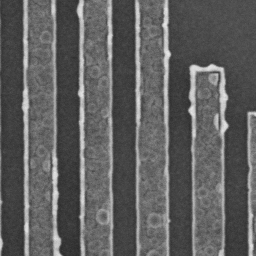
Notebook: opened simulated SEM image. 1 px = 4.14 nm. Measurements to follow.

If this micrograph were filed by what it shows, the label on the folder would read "parallel lines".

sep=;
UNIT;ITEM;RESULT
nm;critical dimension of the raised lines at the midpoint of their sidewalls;127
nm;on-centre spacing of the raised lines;232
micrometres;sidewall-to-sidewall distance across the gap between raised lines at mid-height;0.102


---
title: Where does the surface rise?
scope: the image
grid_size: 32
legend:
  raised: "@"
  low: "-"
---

---@@@@---@@@@---@@@@-----------
---@@@@---@@@@---@@@@-----------
---@@@@---@@@@---@@@@-----------
---@@@@---@@@@---@@@@-----------
---@@@@---@@@@---@@@@-----------
---@@@@---@@@@---@@@@-----------
---@@@@---@@@@---@@@@-----------
---@@@@---@@@@---@@@@-----------
---@@@@---@@@@---@@@@---@@@@----
---@@@@---@@@@---@@@@---@@@@----
---@@@@---@@@@---@@@@---@@@@----
---@@@@---@@@@---@@@@---@@@@----
---@@@@---@@@@---@@@@---@@@@----
---@@@@---@@@@---@@@@---@@@@----
---@@@@---@@@@---@@@@---@@@@---@
---@@@@---@@@@---@@@@---@@@@---@
---@@@@---@@@@---@@@@---@@@@---@
---@@@@---@@@@---@@@@---@@@@---@
---@@@@---@@@@---@@@@---@@@@---@
---@@@@---@@@@---@@@@---@@@@---@
---@@@@---@@@@---@@@@---@@@@---@
---@@@@---@@@@---@@@@---@@@@---@
---@@@@---@@@@---@@@@---@@@@---@
---@@@@---@@@@---@@@@---@@@@---@
---@@@@---@@@@---@@@@---@@@@---@
---@@@@---@@@@---@@@@---@@@@---@
---@@@@---@@@@---@@@@---@@@@---@
---@@@@---@@@@---@@@@---@@@@---@
---@@@@---@@@@---@@@@---@@@@---@
---@@@@---@@@@---@@@@---@@@@---@
---@@@@@--@@@@---@@@@---@@@@---@
---@@@@---@@@@---@@@@---@@@@---@